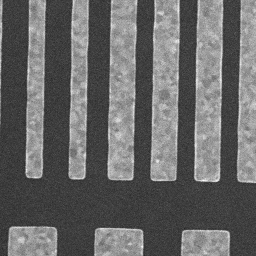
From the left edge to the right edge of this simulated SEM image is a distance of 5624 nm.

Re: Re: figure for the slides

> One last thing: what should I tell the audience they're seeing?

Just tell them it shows groups of lines, slits or small figures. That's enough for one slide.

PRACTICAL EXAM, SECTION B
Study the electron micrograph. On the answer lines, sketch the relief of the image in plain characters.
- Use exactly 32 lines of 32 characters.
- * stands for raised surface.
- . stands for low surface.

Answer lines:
....**...**...***..***...***..**
....**...**...***..***...***..**
....**...**...***..***...***..**
....**...**...***..***...***..**
....**...**...***..***...***..**
....**...**...***..***...***..**
....**...**...***..***...***..**
....*....**...***..***...***..**
....*....**...***..***...***..**
....*....**...***..***...***..**
...**....**...***..***...***..**
...**....**...***..***...***..**
...**....**...***..***...***..**
...**....**...***..***...***..**
...**....**...***..***...***..**
...**....**...***..***...**...**
...**....**...***..***..***...**
...**....**...***..***..***...**
...**....**...***..***...**...**
...**....**...***..***..***...**
...**....**...***..***..***...**
...**....**...***..***..***...**
.....................*...**...**
................................
................................
................................
................................
................................
..*****.........................
.******.....******.....******...
.******.....******.....******...
.******.....******.....******...